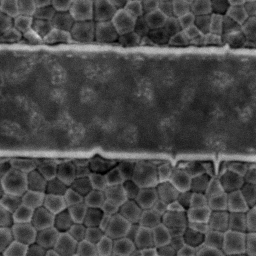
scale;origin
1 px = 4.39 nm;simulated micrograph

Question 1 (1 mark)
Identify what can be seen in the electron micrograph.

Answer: one or a few lines or trenches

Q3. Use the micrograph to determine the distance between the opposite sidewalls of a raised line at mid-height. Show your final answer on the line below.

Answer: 469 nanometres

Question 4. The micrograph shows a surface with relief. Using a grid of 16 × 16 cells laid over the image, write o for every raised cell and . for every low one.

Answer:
................
................
................
oooooooooooooooo
oooooooooooooooo
oooooooooooooooo
oooooooooooooooo
oooooooooooooooo
oooooooooooooooo
oooooooooooooooo
................
................
................
................
................
................